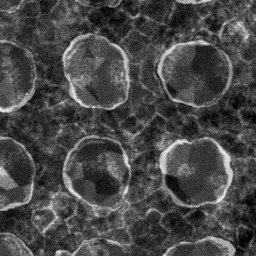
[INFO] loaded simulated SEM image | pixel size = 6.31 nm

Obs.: raised bodies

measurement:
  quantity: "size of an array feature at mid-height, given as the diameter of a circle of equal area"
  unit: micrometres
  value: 0.434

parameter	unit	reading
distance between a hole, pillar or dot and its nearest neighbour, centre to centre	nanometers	620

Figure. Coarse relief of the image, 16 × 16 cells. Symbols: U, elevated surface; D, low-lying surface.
UDDDDDDDDDDDDDDD
DDDDDDDDDDDDDDDD
DDDDDUUDDDDDDDDD
UUDDUUUUDDUUUUDD
UUDDUUUUDDUUUUDD
UUDDUUUUDDUUUUDD
UDDDDUUUDDDDUDDD
DDDDDDDDDDDDDDDD
DDDDDDDDDDDDDDDD
UUDDUUUUDDUUUUDD
UUDDUUUUDDUUUUDD
UUDDUUUUDDUUUUDD
UUDDDUUUDDDUUUDD
DDDDDDDDDDDDDDDD
DDDDDDDDDDDDDDDD
UUDDDUUUDDDUUUDD